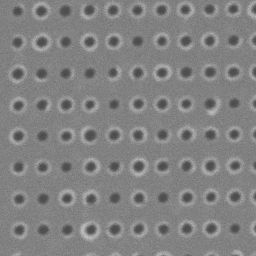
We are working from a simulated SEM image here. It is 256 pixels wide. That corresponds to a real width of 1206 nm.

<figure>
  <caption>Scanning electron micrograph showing a regular array of holes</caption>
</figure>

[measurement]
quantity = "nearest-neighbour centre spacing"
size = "112 nm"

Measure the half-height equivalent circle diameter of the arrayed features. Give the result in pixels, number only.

10.4